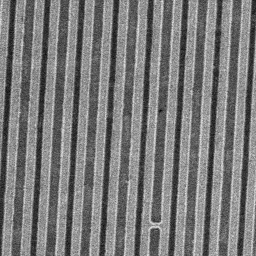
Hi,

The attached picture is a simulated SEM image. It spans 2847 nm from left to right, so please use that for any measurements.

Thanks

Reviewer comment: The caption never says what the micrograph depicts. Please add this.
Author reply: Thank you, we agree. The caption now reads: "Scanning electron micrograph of parallel lines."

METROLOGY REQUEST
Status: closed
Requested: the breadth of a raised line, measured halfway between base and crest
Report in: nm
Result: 97.1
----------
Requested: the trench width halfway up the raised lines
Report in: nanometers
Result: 86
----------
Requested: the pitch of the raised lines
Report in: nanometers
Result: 192